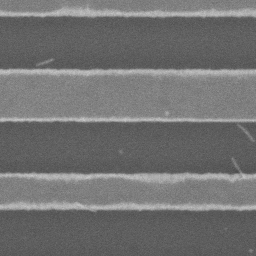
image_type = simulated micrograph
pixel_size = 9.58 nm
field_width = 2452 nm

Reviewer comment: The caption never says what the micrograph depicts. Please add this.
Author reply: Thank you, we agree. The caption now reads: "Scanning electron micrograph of lines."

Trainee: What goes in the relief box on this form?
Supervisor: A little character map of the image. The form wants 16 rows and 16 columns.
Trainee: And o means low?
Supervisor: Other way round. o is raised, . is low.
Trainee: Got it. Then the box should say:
oooooooooooooooo
................
................
................
oooooooooooooooo
oooooooooooooooo
oooooooooooooooo
oooooooooooooooo
................
................
................
oooooooooooooooo
oooooooooooooooo
................
................
................